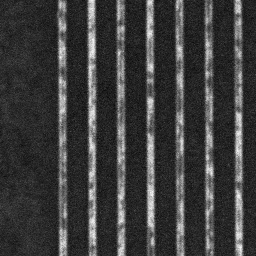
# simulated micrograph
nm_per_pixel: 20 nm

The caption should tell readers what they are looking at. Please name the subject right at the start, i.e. parallel lines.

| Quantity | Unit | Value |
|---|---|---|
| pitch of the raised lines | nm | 586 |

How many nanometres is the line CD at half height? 110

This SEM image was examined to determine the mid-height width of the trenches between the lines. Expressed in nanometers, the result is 482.